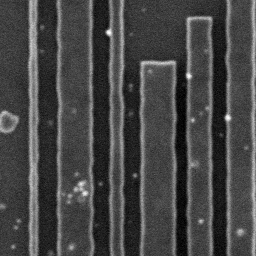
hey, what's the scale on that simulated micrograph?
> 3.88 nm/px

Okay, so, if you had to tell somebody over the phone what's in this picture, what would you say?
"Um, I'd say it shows groups of lines, slits or small figures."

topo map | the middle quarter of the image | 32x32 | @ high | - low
@@@@@@@----@@@@----@@@@@@@@@---@
@@@@@@@----@@@@----@@@@@@@@@---@
@@@@@@@----@@@@----@@@@@@@@@---@
@@@@@@@----@@@-----@@@@@@@@@---@
@@@@@@@----@@@-----@@@@@@@@@---@
@@@@@@@-----@@-----@@@@@@@@@---@
@@@@@@@-----@@-----@@@@@@@@@---@
@@@@@@@-----@@-----@@@@@@@@@---@
@@@@@@@----@@@@----@@@@@@@@@---@
@@@@@@@----@@@@----@@@@@@@@@---@
@@@@@@@-----@@@----@@@@@@@@@---@
@@@@@@@-----@@@----@@@@@@@@@---@
@@@@@@@-----@@@----@@@@@@@@@---@
@@@@@@@----@@@@----@@@@@@@@@---@
@@@@@@@-----@@@----@@@@@@@@@---@
@@@@@@@-----@@@-----@@@@@@@@---@
@@@@@@@-----@@@----@@@@@@@@@---@
@@@@@@@-----@@@----@@@@@@@@@---@
@@@@@@@-----@@@----@@@@@@@@@---@
@@@@@@@-----@@@----@@@@@@@@----@
@@@@@@@-----@@@-----@@@@@@@----@
@@@@@@@-----@@@-----@@@@@@@@---@
@@@@@@@-----@@@-----@@@@@@@@---@
@@@@@@@-----@@@-----@@@@@@@@---@
@@@@@@@-----@@@-----@@@@@@@@---@
@@@@@@@----@@@@----@@@@@@@@@---@
@@@@@@@----@@@@----@@@@@@@@@---@
@@@@@@@----@@@@----@@@@@@@@@---@
@@@@@@@----@@@@----@@@@@@@@@---@
@@@@@@@----@@@@----@@@@@@@@@---@
@@@@@@@-----@@@----@@@@@@@@@---@
@@@@@@@-----@@@----@@@@@@@@@---@